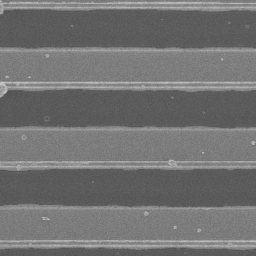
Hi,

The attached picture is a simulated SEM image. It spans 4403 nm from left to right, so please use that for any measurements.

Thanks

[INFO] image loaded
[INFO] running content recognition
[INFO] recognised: lines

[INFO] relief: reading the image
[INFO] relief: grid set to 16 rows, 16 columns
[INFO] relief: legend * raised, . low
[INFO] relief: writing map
*...........****
................
................
****************
****************
***.....**.*****
................
................
****************
****************
.*..............
................
................
****************
****************
................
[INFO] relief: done